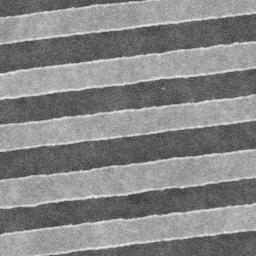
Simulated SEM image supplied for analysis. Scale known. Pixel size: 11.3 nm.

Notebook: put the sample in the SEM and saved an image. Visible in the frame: lines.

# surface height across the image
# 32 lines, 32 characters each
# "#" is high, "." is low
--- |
...............#################
......##########################
#########################.......
#################...............
#########.......................
.............................###
.....................###########
.............###################
.....###########################
#########################.......
################................
#######.........................
............................####
...................#############
..........######################
..###########################...
####################............
############....................
####............................
.........................#######
..................##############
..........######################
.#############################..
######################..........
###############.................
#####...........................
........................########
..............##################
......##########################
##########################......
#################...............
#########.......................